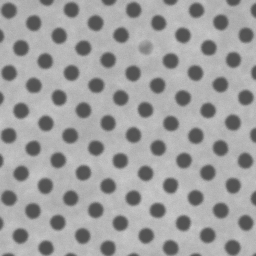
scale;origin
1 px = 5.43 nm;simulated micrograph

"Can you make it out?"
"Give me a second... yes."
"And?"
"a regular array of holes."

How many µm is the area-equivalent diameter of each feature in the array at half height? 0.0849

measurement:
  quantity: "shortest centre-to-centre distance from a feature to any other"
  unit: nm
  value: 149